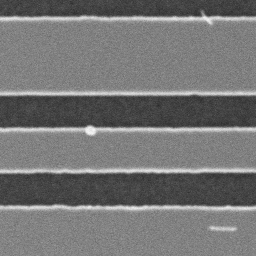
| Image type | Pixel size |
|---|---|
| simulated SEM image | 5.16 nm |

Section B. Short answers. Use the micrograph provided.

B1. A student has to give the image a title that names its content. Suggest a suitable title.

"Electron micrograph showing lines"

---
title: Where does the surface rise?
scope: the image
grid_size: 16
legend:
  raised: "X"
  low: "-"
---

----------------
XXXXXXXXXXXXXXXX
XXXXXXXXXXXXXXXX
XXXXXXXXXXXXXXXX
XXXXXXXXXXXXXXXX
XXXXXXXXXXXXXXXX
----------------
----------------
XXXXXXXXXXXXXXXX
XXXXXXXXXXXXXXXX
XXXXXXXXXXXXXXXX
----------------
----------------
XXXXXXXXXXXXXXXX
XXXXXXXXXXXXXXXX
XXXXXXXXXXXXXXXX